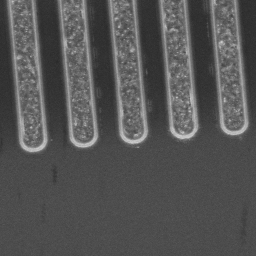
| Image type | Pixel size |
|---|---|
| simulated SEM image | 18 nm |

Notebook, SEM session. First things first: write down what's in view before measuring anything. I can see parallel lines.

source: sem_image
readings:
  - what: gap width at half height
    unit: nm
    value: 440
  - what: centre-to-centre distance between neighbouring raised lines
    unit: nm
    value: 907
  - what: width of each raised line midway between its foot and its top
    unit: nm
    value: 458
